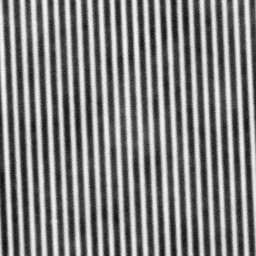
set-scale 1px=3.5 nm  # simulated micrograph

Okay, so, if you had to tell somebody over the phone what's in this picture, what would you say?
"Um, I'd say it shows parallel lines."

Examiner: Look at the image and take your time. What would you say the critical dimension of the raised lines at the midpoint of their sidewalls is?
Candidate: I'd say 0.0131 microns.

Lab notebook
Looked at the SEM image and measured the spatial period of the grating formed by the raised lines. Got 11.2 pixels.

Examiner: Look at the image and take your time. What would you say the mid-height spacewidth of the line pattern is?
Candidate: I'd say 26.2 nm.